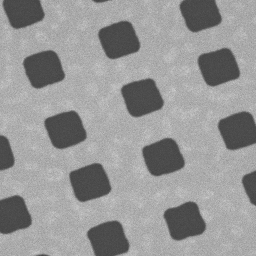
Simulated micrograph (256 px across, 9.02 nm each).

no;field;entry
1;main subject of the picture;a regular array of holes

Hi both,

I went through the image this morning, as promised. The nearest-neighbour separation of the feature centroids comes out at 566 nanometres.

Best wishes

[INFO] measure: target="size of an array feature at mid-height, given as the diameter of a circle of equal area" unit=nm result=347